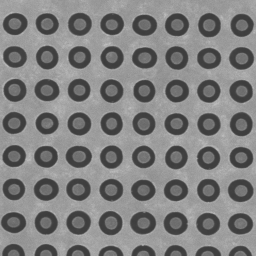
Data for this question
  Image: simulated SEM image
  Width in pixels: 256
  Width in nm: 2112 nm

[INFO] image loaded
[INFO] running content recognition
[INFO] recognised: a regular array of ring-shaped grooves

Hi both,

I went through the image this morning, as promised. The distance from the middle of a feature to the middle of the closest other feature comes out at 265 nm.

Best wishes